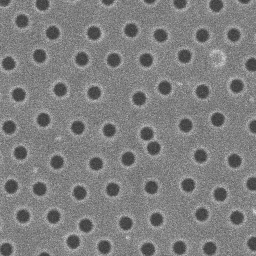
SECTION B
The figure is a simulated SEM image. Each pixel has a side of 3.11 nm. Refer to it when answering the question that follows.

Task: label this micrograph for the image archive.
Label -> a regular array of holes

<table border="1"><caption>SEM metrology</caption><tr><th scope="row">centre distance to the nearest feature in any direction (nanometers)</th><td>94.9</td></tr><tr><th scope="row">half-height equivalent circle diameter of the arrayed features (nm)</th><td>45.1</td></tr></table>